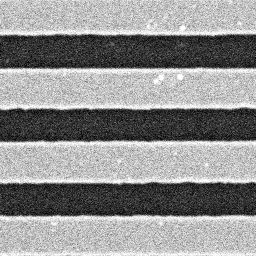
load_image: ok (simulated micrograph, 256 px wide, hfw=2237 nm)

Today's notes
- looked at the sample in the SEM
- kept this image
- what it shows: lines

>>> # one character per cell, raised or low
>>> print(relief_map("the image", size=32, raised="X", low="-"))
XXXXXXXXXXXXXXXXXXXXXXXXXXXXXXXX
XXXXXXXXXXXXXXXXXXXXXXXXXXXXXXXX
XXXXXXXXXXXXXXXXXXXXXXXXXXXXXXXX
XXXXXXXXXXXXXXXXXXXXXXXXXXXXXXXX
--------------------------------
--------------------------------
--------------------------------
--------------------------------
--------------------------------
XXXXXXXXXXXXXXXXXXXXXXXXXXXXXXXX
XXXXXXXXXXXXXXXXXXXXXXXXXXXXXXXX
XXXXXXXXXXXXXXXXXXXXXXXXXXXXXXXX
XXXXXXXXXXXXXXXXXXXXXXXXXXXXXXXX
XX-X---XX--X----XXX----X----X---
--------------------------------
--------------------------------
--------------------------------
--------------------------------
XXXXXXXXXXXXXXXXXXXXXXXXXXXXXXXX
XXXXXXXXXXXXXXXXXXXXXXXXXXXXXXXX
XXXXXXXXXXXXXXXXXXXXXXXXXXXXXXXX
XXXXXXXXXXXXXXXXXXXXXXXXXXXXXXXX
XXXXXXXXXXXXXXXXXXXXXXXXXXXXXXXX
--------------------------------
--------------------------------
--------------------------------
--------------------------------
XXXXXXXXXXXXXXXXXXXXXXXXXXXXXXXX
XXXXXXXXXXXXXXXXXXXXXXXXXXXXXXXX
XXXXXXXXXXXXXXXXXXXXXXXXXXXXXXXX
XXXXXXXXXXXXXXXXXXXXXXXXXXXXXXXX
XXXXXXXXXXXXXXXXXXXXXXXXXXXXXXXX